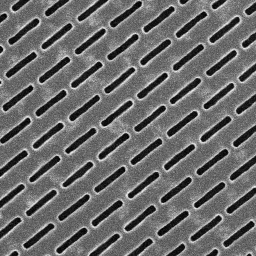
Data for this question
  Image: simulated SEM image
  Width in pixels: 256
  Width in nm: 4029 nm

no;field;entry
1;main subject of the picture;a regular array of holes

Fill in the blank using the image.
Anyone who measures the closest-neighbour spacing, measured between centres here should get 519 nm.